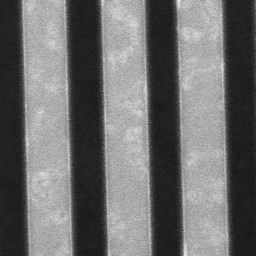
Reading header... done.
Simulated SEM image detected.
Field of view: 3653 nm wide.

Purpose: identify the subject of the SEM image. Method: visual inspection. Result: one or a few lines or trenches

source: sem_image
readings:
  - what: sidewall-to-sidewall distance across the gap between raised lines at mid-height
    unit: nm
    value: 587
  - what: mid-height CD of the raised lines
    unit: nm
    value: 519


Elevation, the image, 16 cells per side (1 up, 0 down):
1000110001100011
1000110001100011
1000110001100011
1100110001100011
1100110001100011
1100111001100011
1100111001100011
1100111001100011
1100111001100011
1100111001100011
1100111001100011
1100111001100011
1100111001100011
1100111001100011
1100111001110011
1100111001110011